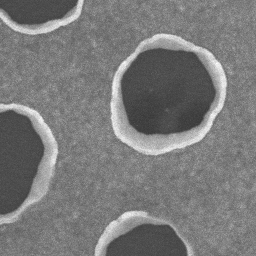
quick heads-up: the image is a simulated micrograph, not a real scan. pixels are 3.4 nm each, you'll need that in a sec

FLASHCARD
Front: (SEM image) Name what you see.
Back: holes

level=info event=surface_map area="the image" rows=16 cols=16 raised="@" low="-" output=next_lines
-----@@@@@@@@@@@
@--@@@@@@@@@@@@@
@@@@@@@@@@@@@@@@
@@@@@@@@@----@@@
@@@@@@@@-----@@@
@@@@@@@-------@@
@@@@@@@@------@@
--@@@@@@-----@@@
---@@@@@@--@@@@@
---@@@@@@@@@@@@@
---@@@@@@@@@@@@@
--@@@@@@@@@@@@@@
--@@@@@@@@@@@@@@
@@@@@@@@@@@@@@@@
@@@@@@@----@@@@@
@@@@@@@-----@@@@